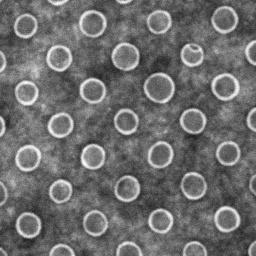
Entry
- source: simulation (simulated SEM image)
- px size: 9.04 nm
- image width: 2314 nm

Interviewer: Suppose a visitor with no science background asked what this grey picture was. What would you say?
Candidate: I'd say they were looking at a regular array of raised bodies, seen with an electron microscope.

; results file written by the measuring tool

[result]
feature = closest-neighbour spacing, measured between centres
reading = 421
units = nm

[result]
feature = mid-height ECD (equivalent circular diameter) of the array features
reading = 212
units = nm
